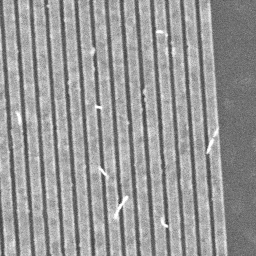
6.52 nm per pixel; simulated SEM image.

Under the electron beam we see parallel lines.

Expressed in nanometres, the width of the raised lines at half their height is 61.8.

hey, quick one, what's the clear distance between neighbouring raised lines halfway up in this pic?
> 34.1 nanometers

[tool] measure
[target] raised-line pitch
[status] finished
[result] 0.0981 um